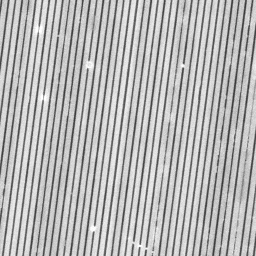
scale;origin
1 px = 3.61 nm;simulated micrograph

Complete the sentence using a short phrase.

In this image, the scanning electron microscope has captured parallel lines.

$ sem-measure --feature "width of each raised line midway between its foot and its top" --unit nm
19.2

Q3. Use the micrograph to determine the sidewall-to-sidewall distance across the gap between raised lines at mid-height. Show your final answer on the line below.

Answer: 6.3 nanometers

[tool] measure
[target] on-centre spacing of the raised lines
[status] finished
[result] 6.7 px